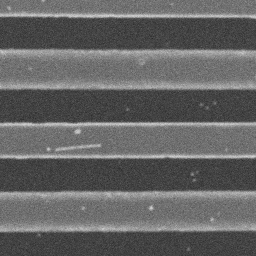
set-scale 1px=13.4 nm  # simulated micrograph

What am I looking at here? lines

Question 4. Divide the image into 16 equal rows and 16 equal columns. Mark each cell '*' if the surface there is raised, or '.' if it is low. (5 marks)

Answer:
****************
................
................
****************
****************
................
................
................
****************
****************
................
................
****************
****************
................
................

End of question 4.